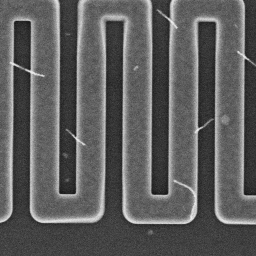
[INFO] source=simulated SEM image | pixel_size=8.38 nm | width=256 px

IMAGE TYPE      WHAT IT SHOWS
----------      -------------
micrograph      groups of lines, slits or small figures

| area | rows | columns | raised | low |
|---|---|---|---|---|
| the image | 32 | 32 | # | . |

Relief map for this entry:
#######...#########..##########.
#######...#########..##########.
##.####...###..####..####.#####.
##..###...###...###..###...####.
##..###...###...###..####..####.
##..###...###...###..####..####.
##..###...###...###..####..####.
##..###...###...###..####..####.
##..###...###..####..####..####.
##..###...###..####..####..####.
##..###...###..####..####..###..
##..###...###..####..####..###..
##..###...###..####..####..###..
##..###...###..####..####..###..
##..###...###..####..####..###..
##..###...###..####..####..###..
#...###...###..####..####..###..
#...###..####..####..####..###..
#...###...###..####..####..###..
#...###...###..####..####..###..
#...###...###..####..####..###..
#...###...###..####..####..###..
#...###...###..####..####..###..
#...###...###..####..####..###..
#...#########...#########..#####
#...#########...########...#####
#...#########...########...#####
#....######.....########....####
................................
................................
................................
................................